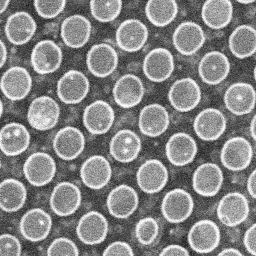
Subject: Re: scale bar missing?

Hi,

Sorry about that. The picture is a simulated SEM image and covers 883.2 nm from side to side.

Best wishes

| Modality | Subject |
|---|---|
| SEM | a regular array of raised bodies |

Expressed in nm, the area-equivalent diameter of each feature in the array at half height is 103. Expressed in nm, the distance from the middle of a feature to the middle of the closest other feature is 134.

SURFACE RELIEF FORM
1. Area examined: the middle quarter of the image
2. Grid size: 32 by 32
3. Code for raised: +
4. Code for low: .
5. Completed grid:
......+++++++.......+++++++.....
.......+++++........+++++++.....
.+++....+++..........+++++......
+++++..........+++...++++.......
++++++.......++++++.........++++
++++++.......++++++........+++++
++++++.......+++++++.......+++++
+++++........+++++++......++++++
+++++........++++++.......++++++
.++.....+....++++++........+++++
.......++++....+......++....++++
......++++++........+++++....++.
.....+++++++.......+++++++......
.....+++++++.......+++++++......
.....+++++++.......+++++++......
......+++++........+++++++......
+++...+++++........++++++.......
++++.........+++++...+++........
+++++.......++++++.........+++++
+++++.......+++++++.......++++++
+++++.......+++++++.......++++++
++++........+++++++.......++++++
++++........++++++........++++++
++.....+++...++++.........++++++
......+++++..........++....++++.
.....++++++.........+++++.......
....++++++++.......++++++.......
....++++++++.......+++++++......
.....++++++........+++++++......
.....++++++........++++++.......
+++...++++.........++++++.......
+++..........++++...++++........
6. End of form